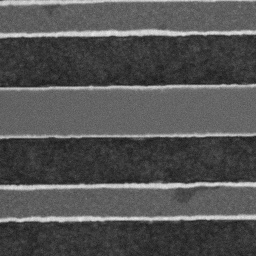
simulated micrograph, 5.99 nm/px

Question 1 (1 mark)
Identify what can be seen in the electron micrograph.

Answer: lines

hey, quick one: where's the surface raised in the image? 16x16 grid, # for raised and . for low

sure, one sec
################
################
................
................
................
.....###########
################
################
###########.....
................
................
.............#..
################
################
................
................